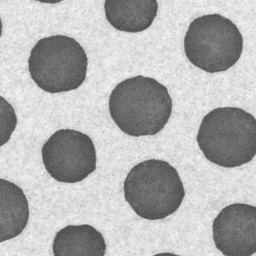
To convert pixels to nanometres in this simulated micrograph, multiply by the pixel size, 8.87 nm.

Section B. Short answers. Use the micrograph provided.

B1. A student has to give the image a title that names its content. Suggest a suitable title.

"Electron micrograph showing holes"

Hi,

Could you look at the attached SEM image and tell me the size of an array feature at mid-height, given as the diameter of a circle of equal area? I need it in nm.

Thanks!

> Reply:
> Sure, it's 531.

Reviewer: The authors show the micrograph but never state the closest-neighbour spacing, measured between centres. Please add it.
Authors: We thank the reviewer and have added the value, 0.77 µm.